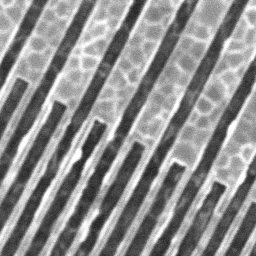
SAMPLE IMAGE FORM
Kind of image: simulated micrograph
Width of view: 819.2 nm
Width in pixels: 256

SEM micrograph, parallel lines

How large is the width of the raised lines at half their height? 0.0248 um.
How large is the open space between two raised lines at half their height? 0.046 um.